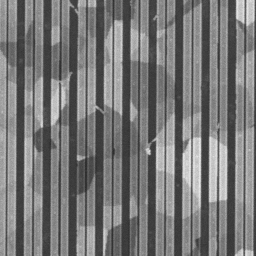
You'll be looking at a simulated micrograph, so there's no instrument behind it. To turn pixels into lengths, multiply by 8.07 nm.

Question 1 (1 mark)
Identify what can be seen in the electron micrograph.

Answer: parallel lines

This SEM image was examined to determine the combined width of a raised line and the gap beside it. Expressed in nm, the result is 107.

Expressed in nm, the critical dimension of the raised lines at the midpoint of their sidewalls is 52.5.